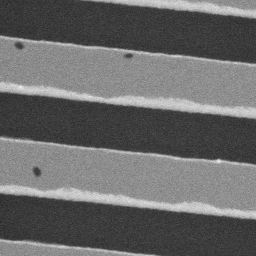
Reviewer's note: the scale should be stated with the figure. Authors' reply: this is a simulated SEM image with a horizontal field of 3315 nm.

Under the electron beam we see lines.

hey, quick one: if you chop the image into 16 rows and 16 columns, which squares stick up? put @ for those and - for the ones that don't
-----------@@@@@
----------------
@@--------------
@@@@@@@@@@@@----
@@@@@@@@@@@@@@@@
@@@@@@@@@@@@@@@@
--------@@@@@@@@
----------------
----------------
@@@@@@@@--------
@@@@@@@@@@@@@@@@
@@@@@@@@@@@@@@@@
-----@@@@@@@@@@@
--------------@@
----------------
@@@@@-----------